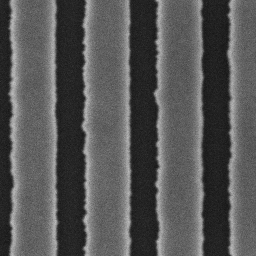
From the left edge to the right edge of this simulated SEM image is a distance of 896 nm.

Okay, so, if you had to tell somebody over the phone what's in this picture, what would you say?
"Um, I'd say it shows lines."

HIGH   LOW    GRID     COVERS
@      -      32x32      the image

-@@@@@@----@@@@@----@@@@@----@@@
-@@@@@@----@@@@@----@@@@@----@@@
-@@@@@@----@@@@@----@@@@@----@@@
-@@@@@@---@@@@@@----@@@@@----@@@
-@@@@@@----@@@@@----@@@@@----@@@
-@@@@@@----@@@@@----@@@@@----@@@
--@@@@@---@@@@@@----@@@@@----@@@
-@@@@@@----@@@@@----@@@@@----@@@
-@@@@@@---@@@@@@----@@@@@----@@@
-@@@@@@---@@@@@@----@@@@@----@@@
-@@@@@@----@@@@@----@@@@@----@@@
-@@@@@@---@@@@@@---@@@@@@----@@@
-@@@@@@----@@@@@---@@@@@@----@@@
--@@@@@----@@@@@----@@@@@----@@@
--@@@@@---@@@@@@----@@@@@----@@@
-@@@@@@---@@@@@@----@@@@@----@@@
-@@@@@@----@@@@@----@@@@@----@@@
-@@@@@@----@@@@@----@@@@@----@@@
-@@@@@@---@@@@@@----@@@@@----@@@
-@@@@@@----@@@@@----@@@@@----@@@
-@@@@@@----@@@@@----@@@@@----@@@
-@@@@@@----@@@@@----@@@@@----@@@
--@@@@@----@@@@@----@@@@@----@@@
--@@@@@----@@@@@----@@@@@----@@@
-@@@@@@----@@@@@----@@@@@----@@@
--@@@@@----@@@@@----@@@@@----@@@
-@@@@@@----@@@@@----@@@@@----@@@
-@@@@@@---@@@@@@----@@@@@----@@@
-@@@@@@----@@@@@----@@@@@----@@@
-@@@@@@----@@@@@----@@@@@----@@@
-@@@@@@----@@@@@----@@@@@----@@@
-@@@@@@----@@@@@----@@@@@----@@@